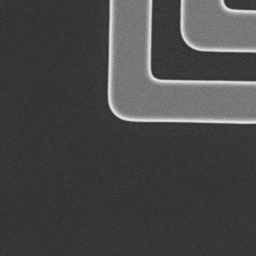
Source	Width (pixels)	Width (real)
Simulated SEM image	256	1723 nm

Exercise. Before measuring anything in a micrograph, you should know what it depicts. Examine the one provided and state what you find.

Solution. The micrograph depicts groups of lines, slits or small figures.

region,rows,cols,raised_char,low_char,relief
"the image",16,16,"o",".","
.......oo..ooo..
.......oo..ooooo
.......oo...oooo
.......oo.......
.......oo.......
.......ooooooooo
.......ooooooooo
........oooooooo
................
................
................
................
................
................
................
................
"